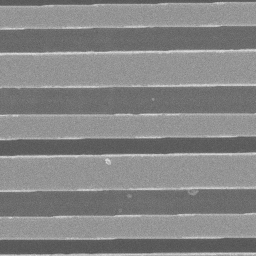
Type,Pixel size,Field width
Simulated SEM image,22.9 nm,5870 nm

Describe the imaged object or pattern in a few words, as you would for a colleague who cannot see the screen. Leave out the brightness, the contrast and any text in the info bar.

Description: lines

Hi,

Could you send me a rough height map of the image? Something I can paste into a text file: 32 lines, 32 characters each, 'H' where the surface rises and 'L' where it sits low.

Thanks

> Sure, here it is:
LLLLLLLLLLLLLLLLLLLLHHHHHHHHHHHH
HHHHHHHHHHHHHHHHHHHHHHHHHHHHHHHH
HHHHHHHHHHHHHHHHHHHHHHHHHHHHHHHH
HHHHHHHHHHHHLLLLLLLLLLLLLLLLLLLL
LLLLLLLLLLLLLLLLLLLLLLLLLLLLLLLL
LLLLLLLLLLLLLLLLLLLLLLLLLLLLLLLL
LLLLLLLLLLLHLHHHHHHHHHHHHHHHHHHH
HHHHHHHHHHHHHHHHHHHHHHHHHHHHHHHH
HHHHHHHHHHHHHHHHHHHHHHHHHHHHHHHH
HHHHHHHHHHHHHHHHHHHHHHHHHHHHHHHH
HHHHHHHHHHHHHHHHHHHHHHHHHHHHHHHH
LLLLLLLLLLLLLLLLLLLLLLLLLLLLLLLL
LLLLLLLLLLLLLLLLLLLLLLLLLLLLLLLL
LLLLLLLLLLLLLLLLLLLLLLLLLLLLLLLL
HHHHHHHHHHHHHHHHHHHHHHHHHHHHHHHH
HHHHHHHHHHHHHHHHHHHHHHHHHHHHHHHH
HHHHHHHHHHHHHHHHHHHHHHHHHHHHHHHH
LLLLLLLLLLLLLLLLLLLLLLLLLLLLLLLL
LLLLLLLLLLLLLLLLLLLLLLLLLLLLLLLL
LLHHHHHHHHHHHHHHHHHHHHHHHHHHHHHH
HHHHHHHHHHHHHHHHHHHHHHHHHHHHHHHH
HHHHHHHHHHHHHHHHHHHHHHHHHHHHHHHH
HHHHHHHHHHHHHHHHHHHHHHHHHHHHHHHH
HHHHHHHHHHHHHHHHHHHHHHHHHHHHHHHH
LLLLLLLLLLLLLLLLLLLLLLLLLLLLLLLL
LLLLLLLLLLLLLLLLLLLLLLLLLLLLLLLL
LLLLLLLLLLLLLLLLLLLLLLLLLLLLLLLL
HHHHHHHHHHHHHHHHHHHHHHHHHHHHHHHH
HHHHHHHHHHHHHHHHHHHHHHHHHHHHHHHH
HHHHHHHHHHHHHHHHHHHHHHHHHHHHHHHH
LLLLLLLLLLLLLLLLLLLLLLLLLLLLLLLL
LLLLLLLLLLLLLLLLLLLLLLLLLLLLLLLL